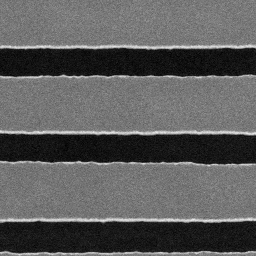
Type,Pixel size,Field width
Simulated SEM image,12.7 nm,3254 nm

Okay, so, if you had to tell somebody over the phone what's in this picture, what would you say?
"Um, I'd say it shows lines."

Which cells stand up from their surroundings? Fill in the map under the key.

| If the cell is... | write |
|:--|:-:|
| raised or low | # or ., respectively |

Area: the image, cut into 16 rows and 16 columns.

################
################
################
................
................
################
################
################
................
................
################
################
################
################
................
................